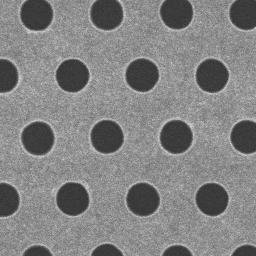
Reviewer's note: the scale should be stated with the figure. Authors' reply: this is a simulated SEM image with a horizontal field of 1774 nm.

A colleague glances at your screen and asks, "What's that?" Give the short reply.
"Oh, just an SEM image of a regular array of holes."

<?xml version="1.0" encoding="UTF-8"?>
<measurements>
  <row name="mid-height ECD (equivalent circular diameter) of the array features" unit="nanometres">227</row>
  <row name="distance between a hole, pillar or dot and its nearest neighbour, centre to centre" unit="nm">479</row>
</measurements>